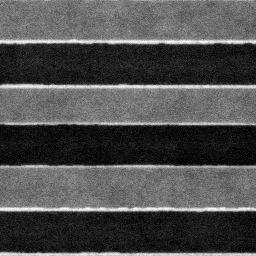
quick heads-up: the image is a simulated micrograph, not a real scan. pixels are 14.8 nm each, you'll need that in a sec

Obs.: lines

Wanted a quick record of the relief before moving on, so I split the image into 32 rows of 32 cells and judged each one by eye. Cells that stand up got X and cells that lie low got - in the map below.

XXXXXXXXXXXXXXXXXXXXXXXXXXXXXXXX
XXXXXXXXXXXXXXXXXXXXXXXXXXXXXXXX
XXXXXXXXXXXXXXXXXXXXXXXXXXXXXXXX
XXXXXXXXXXXXXXXXXXXXXXXXXXXXXXXX
XXXXXXXXXXXXXXXXXXXXXXXXXXXXXXXX
--------------------------------
--------------------------------
--------------------------------
--------------------------------
--------------------------------
--------------------------------
XXXXXXXXXXXXXXXXXXXXXXXXXXXXXXXX
XXXXXXXXXXXXXXXXXXXXXXXXXXXXXXXX
XXXXXXXXXXXXXXXXXXXXXXXXXXXXXXXX
XXXXXXXXXXXXXXXXXXXXXXXXXXXXXXXX
------------------------X-X--XXX
--------------------------------
--------------------------------
--------------------------------
--------------------------------
--------------------------------
XXXXXXXXXXXXXXXXXXXXXXXXXXXXXXXX
XXXXXXXXXXXXXXXXXXXXXXXXXXXXXXXX
XXXXXXXXXXXXXXXXXXXXXXXXXXXXXXXX
XXXXXXXXXXXXXXXXXXXXXXXXXXXXXXXX
XXXXXXXXXXXXXXXXXXXXXXXXXXXXXXXX
--------------------------------
--------------------------------
--------------------------------
--------------------------------
--------------------------------
--------------------------------